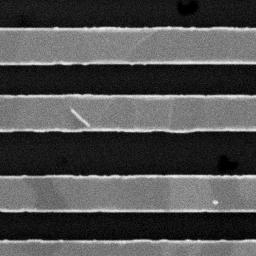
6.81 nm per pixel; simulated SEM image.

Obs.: lines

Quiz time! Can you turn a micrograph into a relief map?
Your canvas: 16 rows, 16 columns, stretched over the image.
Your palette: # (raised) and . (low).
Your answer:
................
................
################
################
................
................
################
################
................
................
................
################
################
................
................
################